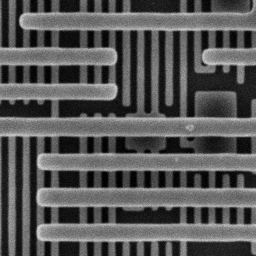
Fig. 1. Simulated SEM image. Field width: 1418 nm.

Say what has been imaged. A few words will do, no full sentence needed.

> wiring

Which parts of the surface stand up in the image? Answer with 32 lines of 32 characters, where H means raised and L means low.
LLLLLLLLLLLLLLLLLLLLLLLLLLLLLLLL
LLLLLLLLLLLLLLLLLLLLLLLLLLLLLLLH
LLLHHHHHHHHHHHHHHHHHHHHHHHHHHHHH
LLLHHHHHHHHHHHHHHHHHHHHHHHHHHHHH
LLLLLLLLLLLLLLLLLLLLLLLLLLLLLLLL
LLLLLLLLLLLLLLLLLLLLLLLLLLLLLLLL
HHHHHHHHHHHHHHLLLLLLLLLLLHHHHHHH
HHHHHHHHHHHHHHHLLLLLLLLLLHHHHHHH
LLLLLLLLLLLLLLLLLLLLLLLLLLLLLLLL
LLLLLLLLLLLLLLLLLLLLLLLLLLLLLLLL
HHHHHHLHHHHLLHLLLLLLLLLLLLLLLLLL
HHHHHHHHHHHHHHHLLLLLLLLLLLLLLLLL
LLLLLLLLLLLLLLLLLLLLLLLLLLLLLLLL
LLLLLLLLLLLLLLLLLLLLLLLLLLLLLLLL
LLLLLLLLLLLLLLLLLLLLLLLLLLLLLLLL
HHHHHHHHHHHHHHHHHHHHHHHHHHHHHHHH
HHHHHHHHHHHHHHHHHHHHHHHHHHHHHHHH
LLLLLLLLLLLLLLLLLLLLLLLLLLLLLLLL
LLLLLLLLLLLLLLLLLLLLLLLLLLLLLLLL
LLLLLHHHHHHHHHHHHHHHHHHHHHHHHHHH
LLLLLHHHHHHHHHHHHHHHHHHHHHHHHHHH
LLLLLLLLLLLLLLLLLLLLLLLLLLLLLLLL
LLLLLLLLLLLLLLLLLLLLLLLLLLLLLLLL
LLLLLLLLLLLLLLLLLLLLLLLLLLLLLLLL
LLLLLHHHHHHHHHHHHHHHHHHHHHHHHHHH
LLLLLHHHHHHHHHHHHHHHHHHHHHHHHHHH
LLLLLLLLLLLLLLLLLLLLLLLLLLLLLLLL
LLLLLLLLLLLLLLLLLLLLLLLLLLLLLLLL
LLLLLHHHHHHHHHHHHHHHHHHHHHHHHHHH
LLLLLHHHHHHHHHHHHHHHHHHHHHHHHHHH
LLLLLLLLLLLLLLLLLLLLLLLLLLLLLLLL
LLLLLLLLLLLLLLLLLLLLLLLLLLLLLLLL